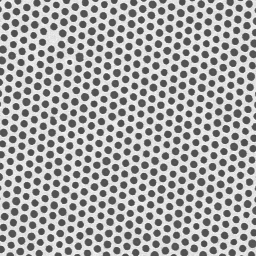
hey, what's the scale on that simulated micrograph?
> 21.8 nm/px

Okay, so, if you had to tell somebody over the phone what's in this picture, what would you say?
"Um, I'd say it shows a regular array of holes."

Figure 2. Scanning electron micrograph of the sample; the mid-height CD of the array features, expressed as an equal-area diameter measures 171 nm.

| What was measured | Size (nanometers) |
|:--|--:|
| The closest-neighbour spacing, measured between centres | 234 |